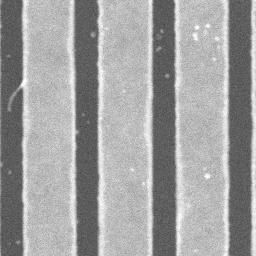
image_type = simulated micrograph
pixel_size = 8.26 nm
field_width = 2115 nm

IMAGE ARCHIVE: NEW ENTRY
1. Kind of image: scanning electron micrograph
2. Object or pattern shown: lines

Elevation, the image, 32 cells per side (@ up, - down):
---@@@@@@---@@@@@@@---@@@@@@@--@
---@@@@@@---@@@@@@@---@@@@@@@--@
---@@@@@@---@@@@@@@---@@@@@@@--@
---@@@@@@---@@@@@@@---@@@@@@@--@
---@@@@@@---@@@@@@@---@@@@@@@--@
---@@@@@@---@@@@@@@---@@@@@@@--@
---@@@@@@---@@@@@@@---@@@@@@@--@
---@@@@@@---@@@@@@@---@@@@@@@--@
---@@@@@@---@@@@@@@---@@@@@@@--@
---@@@@@@---@@@@@@@---@@@@@@@--@
---@@@@@@---@@@@@@@---@@@@@@@--@
---@@@@@@---@@@@@@@---@@@@@@@--@
---@@@@@@---@@@@@@@---@@@@@@@--@
---@@@@@@---@@@@@@@---@@@@@@@--@
---@@@@@@---@@@@@@@---@@@@@@@--@
---@@@@@@---@@@@@@@---@@@@@@@---
---@@@@@@---@@@@@@@---@@@@@@@---
---@@@@@@---@@@@@@@---@@@@@@@--@
---@@@@@@---@@@@@@@---@@@@@@@--@
---@@@@@@---@@@@@@@---@@@@@@@--@
---@@@@@@---@@@@@@@---@@@@@@@--@
---@@@@@@---@@@@@@@---@@@@@@@--@
---@@@@@@---@@@@@@@---@@@@@@@--@
---@@@@@@---@@@@@@@---@@@@@@@--@
---@@@@@@---@@@@@@@---@@@@@@@--@
---@@@@@@---@@@@@@@---@@@@@@@--@
---@@@@@@---@@@@@@@---@@@@@@@--@
---@@@@@@---@@@@@@@---@@@@@@@--@
---@@@@@@---@@@@@@@---@@@@@@@--@
---@@@@@@---@@@@@@@---@@@@@@@--@
---@@@@@@---@@@@@@@---@@@@@@@--@
---@@@@@@---@@@@@@@---@@@@@@@--@